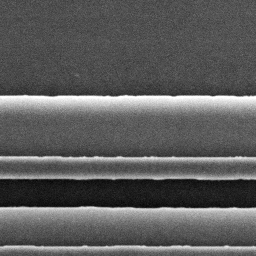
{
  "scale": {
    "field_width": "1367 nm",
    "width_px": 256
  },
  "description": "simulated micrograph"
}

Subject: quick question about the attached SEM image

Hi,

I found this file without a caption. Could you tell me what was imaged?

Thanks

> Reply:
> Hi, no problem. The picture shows lines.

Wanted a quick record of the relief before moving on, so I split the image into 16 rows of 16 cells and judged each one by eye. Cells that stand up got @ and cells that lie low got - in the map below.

----------------
----------------
----------------
----------------
----------------
----------------
@@@@@@@@@@@@@@@@
@@@@@@@@@@@@@@@@
@@@@@@@@@@@@@@@@
@@@@@@@@@@@@@@@@
@@@@@@@@@@@@@@@@
----------------
----------------
@@@@@@@@@@@@@@@@
@@@@@@@@@@@@@@@@
@@@@@@@@@@@@@@@@